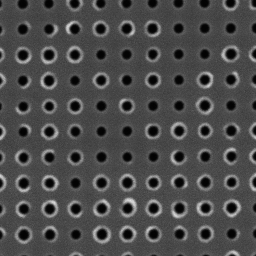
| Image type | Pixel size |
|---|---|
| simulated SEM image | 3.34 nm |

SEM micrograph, a regular array of holes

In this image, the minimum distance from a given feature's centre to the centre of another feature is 25.6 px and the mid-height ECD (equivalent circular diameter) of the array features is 33.5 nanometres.